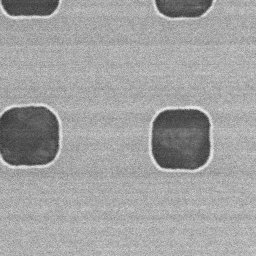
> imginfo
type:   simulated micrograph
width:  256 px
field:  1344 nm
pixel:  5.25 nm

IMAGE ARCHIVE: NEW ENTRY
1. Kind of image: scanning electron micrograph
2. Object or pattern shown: holes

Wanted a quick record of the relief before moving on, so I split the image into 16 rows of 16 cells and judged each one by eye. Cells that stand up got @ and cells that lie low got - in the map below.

----@@@@@@---@@@
@@@@@@@@@@@@@@@@
@@@@@@@@@@@@@@@@
@@@@@@@@@@@@@@@@
@@@@@@@@@@@@@@@@
@@@@@@@@@@@@@@@@
@@@@@@@@@@@@@@@@
----@@@@@@---@@@
----@@@@@----@@@
----@@@@@----@@@
@@@@@@@@@@---@@@
@@@@@@@@@@@@@@@@
@@@@@@@@@@@@@@@@
@@@@@@@@@@@@@@@@
@@@@@@@@@@@@@@@@
@@@@@@@@@@@@@@@@